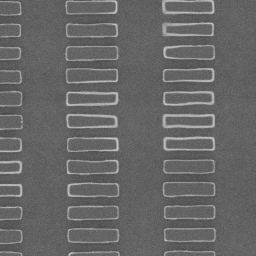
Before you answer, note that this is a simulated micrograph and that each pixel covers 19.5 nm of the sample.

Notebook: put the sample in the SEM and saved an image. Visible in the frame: groups of lines, slits or small figures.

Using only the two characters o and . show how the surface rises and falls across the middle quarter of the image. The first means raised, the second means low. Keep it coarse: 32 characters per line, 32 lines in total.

................................
.oooooooo.ooo............oooo..o
.oooooooooooo............ooooooo
.oooooooooooo............ooooooo
.oooooo.........................
................................
................................
.oooooooooooo............ooooooo
.oooooooooooo............ooooooo
.oooooooooooo............ooooooo
................................
................................
................................
.oooooooooooo............ooooooo
.oooooooooooo............ooooooo
.oooooooooo..............oo...oo
................................
................................
................................
.oooooooooooo............ooooooo
.oooooooooooo............ooooooo
.oooooooooooo...................
................................
................................
.ooooo...oooo............ooooooo
.oooooooooooo............ooooooo
.oooooooooooo............ooooooo
................................
................................
................................
.oooooooooooo............ooooooo
.oooooooooooo............ooooooo